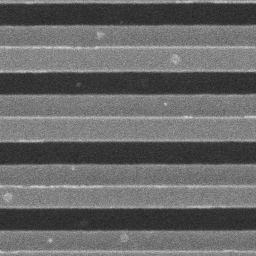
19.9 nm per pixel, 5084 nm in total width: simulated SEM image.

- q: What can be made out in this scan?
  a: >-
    lines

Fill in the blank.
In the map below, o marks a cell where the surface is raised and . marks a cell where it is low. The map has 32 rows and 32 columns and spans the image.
................................
................................
................................
oooooooooooooooooooooooooooooooo
oooooooooooooooooooooooooooooooo
oooooooooooooooooooooooooooooooo
oooooooooooooooooooooooooooooooo
oooooooooooooooooooooooooooooooo
oooooooooooooooooooooooooooooooo
................................
................................
................................
oooooooooooooooooooooooooooooooo
oooooooooooooooooooooooooooooooo
oooooooooooooooooooooooooooooooo
oooooooooooooooooooooooooooooooo
oooooooooooooooooooooooooooooooo
oooooooooooooooooooooooooooooooo
................................
................................
................................
oooooooooooooooooooooooooooooooo
oooooooooooooooooooooooooooooooo
oooooooooooooooooooooooooooooooo
oooooooooooooooooooooooooooooooo
oooooooooooooooooooooooooooooooo
................................
................................
................................
oooooooooooooooooooooooooooooooo
oooooooooooooooooooooooooooooooo
oooooooooooooooooooooooooooooooo